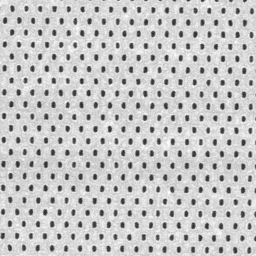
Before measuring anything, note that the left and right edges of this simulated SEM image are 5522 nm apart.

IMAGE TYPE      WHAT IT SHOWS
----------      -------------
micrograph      a regular array of holes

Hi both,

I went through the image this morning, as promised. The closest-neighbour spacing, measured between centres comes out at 293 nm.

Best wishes